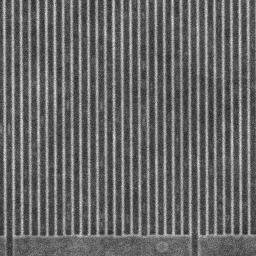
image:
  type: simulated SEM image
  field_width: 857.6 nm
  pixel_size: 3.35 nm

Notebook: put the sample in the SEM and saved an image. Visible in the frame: parallel lines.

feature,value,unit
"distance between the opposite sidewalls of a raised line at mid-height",6.3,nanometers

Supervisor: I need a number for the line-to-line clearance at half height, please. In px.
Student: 6.63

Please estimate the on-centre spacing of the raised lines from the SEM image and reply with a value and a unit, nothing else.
28.1 nanometers